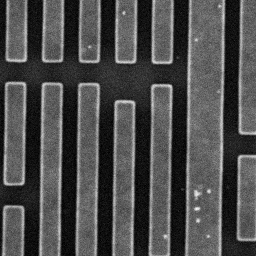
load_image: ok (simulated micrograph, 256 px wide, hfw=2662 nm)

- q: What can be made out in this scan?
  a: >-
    groups of lines, slits or small figures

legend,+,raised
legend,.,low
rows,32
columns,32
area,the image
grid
.++..+++..++...++..+++..++++..++
.++..+++..++...++..+++..++++..++
.++..+++..++...++..+++..++++..++
.++..+++..++...++..+++..++++..++
.++..+++..++...++..+++..++++..++
.++..+++..++...++..+++..++++..++
.++..+++..++...++..+++..++++..++
.++...++..++...++..+++..++++..++
........................++++..++
........................++++..++
.++...+...++............++++..++
.++..+++..++.......++...++++..++
.++..+++..++.......++...++++..++
.++..+++..++..+++..++...++++..++
.++..+++..++..+++..++...++++..++
.++..+++..++..+++..++..+++++..++
.++..+++..++..+++..++..+++++..++
.++..+++..++..+++..++..+++++....
.++..+++..++..+++..++..+++++....
.++..+++..++..+++..++..+++++....
.++..+++..++..+++..++..+++++..++
.++..+++..++..+++..++..+++++..++
.++..+++..++..+++..++..+++++..++
.....+++..++..+++..++..+++++..++
.....++...++..+++..++..+++++..++
.....++...++..+++..++..+++++..++
+++..++...++..+++..++..+++++..++
+++..++...++..+++..++..+++++..++
+++..++...++..+++..++..+++++..++
+++..++...++..+++..++..+++++..++
+++..++...++..+++..++..+++++....
+++..++...++..+++..++..+++++....